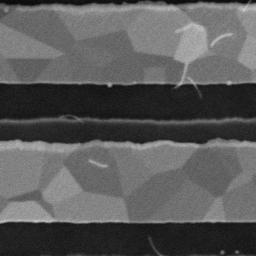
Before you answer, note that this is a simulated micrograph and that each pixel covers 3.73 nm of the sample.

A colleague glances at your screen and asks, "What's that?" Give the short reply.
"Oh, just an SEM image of lines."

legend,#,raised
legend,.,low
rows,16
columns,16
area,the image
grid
################
################
################
################
################
................
................
................
................
################
################
################
################
################
................
................